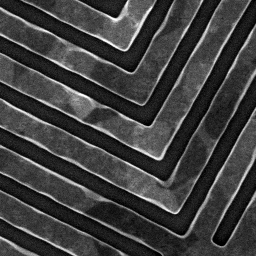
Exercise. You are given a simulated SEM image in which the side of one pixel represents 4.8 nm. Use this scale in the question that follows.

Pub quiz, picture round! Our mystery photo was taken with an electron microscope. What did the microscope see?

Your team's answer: groups of lines, slits or small figures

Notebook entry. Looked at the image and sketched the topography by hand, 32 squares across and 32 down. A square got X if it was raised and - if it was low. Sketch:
----XXXXXXX-----XXX---XXX--XXXX-
X-----XXXXXXX--XXXX--XXXX--XXX--
XXX-----XXXXXXXXXX---XXX--XXXX--
XXXXX----XXXXXXXX---XXX---XXX---
XXXXXXX-----XXXXX--XXXX--XXXX--X
--XXXXXX------XX---XXX---XXX---X
----XXXXXXX-------XXXX--XXX---XX
XX----XXXXXXX-----XXX---XXX--XXX
XXXX----XXXXXXX--XXXX--XXXX--XXX
XXXXXX----XXXXXXXXXX---XXX--XXXX
-XXXXXXX----XXXXXXXX--XXX---XXX-
---XXXXXX-----XXXXX--XXXX--XXXX-
-----XXXXXX-----XX---XXX---XXX--
XX-----XXXXXXX------XXXX--XXXX--
XXXX-----XXXXXX-----XXX---XXX--X
XXXXXX-----XXXXXXX-XXX---XXX---X
-XXXXXXX-----XXXXXXXXX--XXXX--XX
----XXXXXX-----XXXXXX---XXX---XX
X-----XXXXXX-----XXXX--XXXX--XXX
XXX----XXXXXXX-----X---XXX---XXX
XXXXX-----XXXXXX------XXXX--XXX-
XXXXXX-----XXXXXXX----XXX---XXX-
--XXXXXX-----XXXXXXX-XXXX--XXX--
----XXXXXX-----XXXXXXXXX--XXXX--
X-----XXXXXX-----XXXXXXX--XXX---
XXX-----XXXXXXX-----XXX--XXXX--X
XXXXX-----XXXXXXX----X---XXX---X
XXXXXXX-----XXXXXXX-----XXXX--XX
--XXXXXXX-----XXXXXXX---XXX--XXX
-----XXXXXX-----XXXXXXXXXXX--XXX
XX----XXXXXXX-----XXXXXXXXX-XXXX
XXX------XXXXXX-----XXXXXXXXXXXX